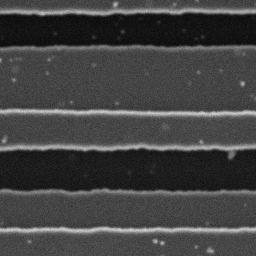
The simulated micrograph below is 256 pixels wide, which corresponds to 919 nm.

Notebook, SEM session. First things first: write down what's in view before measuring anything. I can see lines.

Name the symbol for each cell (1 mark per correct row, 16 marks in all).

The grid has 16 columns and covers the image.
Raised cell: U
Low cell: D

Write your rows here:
UUUUUUUUUUUUUUUU
DDDDDDDDDDDDDDDD
DDDDDDDDDDDDDDDD
UUUUUUUUUUUUUUUU
UUUUUUUUUUUUUUUU
UUUUUUUUUUUUUUUU
UUUUUUUUUUUUUUUU
UUUUUUUUUUUUUUUU
UUUUUUUUUUUUUUUU
DDDDDDDDDDDDDDDD
DDDDDDDDDDDDDDDD
DDDDDDDDDDDDDDDD
UUUUUUUUUUUUUUUU
UUUUUUUUUUUUUUUU
UUUUUUUUUUUUUUUU
UUUUUUUUUUUUUUUU